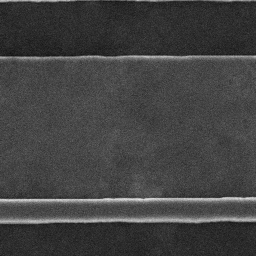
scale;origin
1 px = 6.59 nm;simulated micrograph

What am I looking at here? lines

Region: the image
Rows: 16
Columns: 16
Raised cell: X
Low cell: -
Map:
----------------
----------------
----------------
----------------
XXXXXXXXXXXXXXXX
XXXXXXXXXXXXXXXX
XXXXXXXXXXXXXXXX
XXXXXXXXXXXXXXXX
XXXXXXXXXXXXXXXX
XXXXXXXXXXXXXXXX
XXXXXXXXXXXXXXXX
XXXXXXXXXXXXXXXX
XXXXXXXXXXXXXXXX
XXXXXXXXXXXXXXXX
----------------
----------------